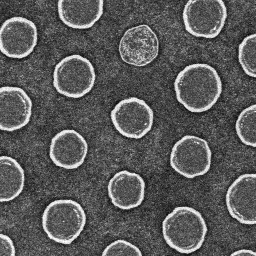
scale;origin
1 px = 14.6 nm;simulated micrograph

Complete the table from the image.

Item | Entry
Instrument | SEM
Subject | a regular array of raised bodies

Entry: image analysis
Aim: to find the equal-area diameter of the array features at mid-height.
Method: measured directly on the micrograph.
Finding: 0.575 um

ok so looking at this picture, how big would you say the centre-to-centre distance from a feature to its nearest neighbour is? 69.8 px